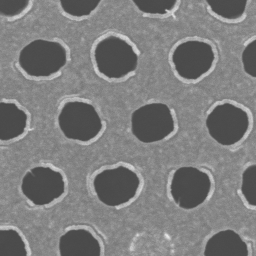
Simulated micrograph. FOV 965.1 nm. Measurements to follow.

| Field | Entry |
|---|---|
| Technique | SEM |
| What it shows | a regular array of holes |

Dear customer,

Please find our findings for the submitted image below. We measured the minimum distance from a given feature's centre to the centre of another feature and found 275 nanometres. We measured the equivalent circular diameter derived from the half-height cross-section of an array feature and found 0.154 micrometres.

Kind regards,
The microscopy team